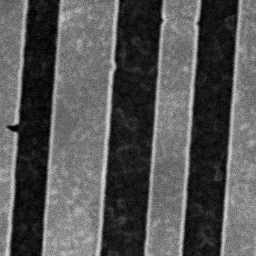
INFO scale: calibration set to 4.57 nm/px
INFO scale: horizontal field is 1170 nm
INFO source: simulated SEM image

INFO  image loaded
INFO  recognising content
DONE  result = one or a few lines or trenches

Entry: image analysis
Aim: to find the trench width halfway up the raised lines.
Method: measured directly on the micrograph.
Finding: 189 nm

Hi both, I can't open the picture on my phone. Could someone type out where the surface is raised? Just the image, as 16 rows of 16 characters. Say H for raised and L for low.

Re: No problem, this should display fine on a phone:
HHLLHHHLLLHHLLLH
HHLLHHHLLLHHLLLH
HLLLHHHLLLHHLLLH
HLLLHHHLLLHHLLLH
HLLLHHHLLLHHLLLH
HLLHHHHLLLHHLLLH
HLLHHHHLLLHHLLLH
HLLHHHHLLLHHLLHH
HLLHHHHLLLHHLLHH
HLLHHHHLLLHHLLHH
HLLHHHHLLHHHLLHH
HLLHHHLLLHHHLLHH
HLLHHHLLLHHHLLHH
HLLHHHLLLHHLLLHH
HLLHHHLLLHHLLLHH
HLLHHHLLLHHLLLHH